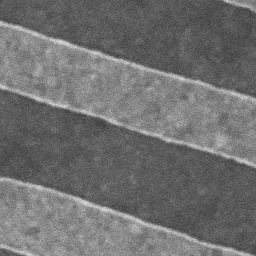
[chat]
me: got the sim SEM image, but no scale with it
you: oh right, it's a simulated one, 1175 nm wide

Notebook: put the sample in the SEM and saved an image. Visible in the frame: one or a few lines or trenches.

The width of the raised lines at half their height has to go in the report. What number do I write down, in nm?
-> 283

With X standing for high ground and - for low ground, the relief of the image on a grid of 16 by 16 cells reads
----------------
----------------
XXX-------------
XXXXXXX---------
XXXXXXXXXX------
XXXXXXXXXXXXX---
---XXXXXXXXXXXXX
-------XXXXXXXXX
----------XXXXXX
-------------XXX
----------------
XX--------------
XXXXX-----------
XXXXXXXX--------
XXXXXXXXXXX-----
XXXXXXXXXXXXXX--